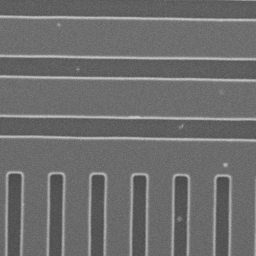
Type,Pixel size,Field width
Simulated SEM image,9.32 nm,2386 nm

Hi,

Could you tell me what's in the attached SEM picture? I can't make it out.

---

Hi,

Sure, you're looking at groups of lines, slits or small figures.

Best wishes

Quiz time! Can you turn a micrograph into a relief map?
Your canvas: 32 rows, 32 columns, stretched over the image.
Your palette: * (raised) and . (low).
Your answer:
................................
................................
********************************
********************************
********************************
********************************
********************************
................................
................................
................................
********************************
********************************
********************************
********************************
********************************
................................
................................
*******************************.
********************************
********************************
********************************
********************************
*..***..***..****.****.****..***
*..***..***..***..****..***..***
*..***..***..***..****..***..***
*..***..***..***..****..***..***
*..***..***..***..****.****..***
*..***..***..***..****.****..***
*..***..***..***..****.****..***
*..***..***..***..****.****..***
*..***..***..***..****.****..***
*..***..***..***..****.****..***